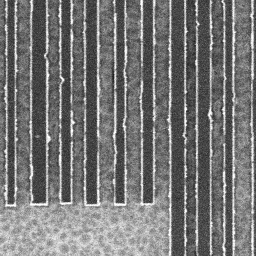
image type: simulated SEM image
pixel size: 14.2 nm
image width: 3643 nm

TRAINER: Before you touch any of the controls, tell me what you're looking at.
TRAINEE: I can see parallel lines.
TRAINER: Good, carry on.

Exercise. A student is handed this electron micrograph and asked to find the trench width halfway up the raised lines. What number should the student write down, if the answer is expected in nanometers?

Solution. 208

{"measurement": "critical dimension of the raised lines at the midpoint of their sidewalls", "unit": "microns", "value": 0.195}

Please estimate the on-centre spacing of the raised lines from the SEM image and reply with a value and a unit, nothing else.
0.383 microns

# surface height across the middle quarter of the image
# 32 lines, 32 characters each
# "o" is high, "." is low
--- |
oo...ooo.....oo....ooo....oooo..
oo...ooo.....oo....ooo....oooo..
oo...ooo.....oo.....ooo...oooo..
oo...ooo.....ooo....ooo...oooo..
oo...oooo....ooo....oo.....ooo..
oo...oooo....ooo...ooo.....ooo..
oo...oooo....ooo....oo.....oooo.
oo...oooo....oo....ooo....ooooo.
oo...ooo.....oo....oooo...oooo..
oo...ooo.....oo....oooo...oooo..
oo...ooo.....oo....oooo...ooooo.
oo...ooo.....oo....ooo....ooooo.
oo...oooo....oo....oooo...oooo..
oo...oooo....oo.....ooo...oooo..
oo...oooo....oo.....oo....ooooo.
oo...ooo.....oo.....oo....ooooo.
oo...ooo.....oo....ooo....oooo..
oo...ooo....ooo.....ooo...oooo..
oo...ooo....ooo.....ooo...ooooo.
oo...ooo.....oo.....oo....oooo..
oo...ooo.....oo.....oo.....ooo..
oo...ooo.....oo.....oo....ooooo.
oo...ooo.....ooo....oo.....ooo..
oo...ooo.....oo.....ooo....ooo..
oo...ooo.....oo.....ooo...oooo..
oo...ooo.....oo.....ooo....oooo.
oo...oooo....ooo....ooo....oooo.
oo...ooo.....ooo...ooo.....oooo.
oo...ooo....oooo....oo.....oooo.
oo...ooo....oooo....oo.....ooo..
oo...oooo....oo....ooo....oooo..
oo...ooo.....ooo....ooo...oooo..